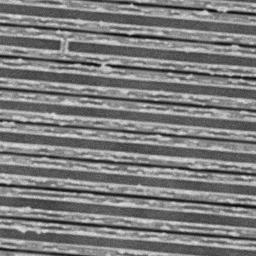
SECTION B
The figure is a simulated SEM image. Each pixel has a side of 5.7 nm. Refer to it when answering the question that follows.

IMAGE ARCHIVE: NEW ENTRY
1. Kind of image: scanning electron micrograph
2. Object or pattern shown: parallel lines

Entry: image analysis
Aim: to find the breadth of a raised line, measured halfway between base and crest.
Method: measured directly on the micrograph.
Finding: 47.6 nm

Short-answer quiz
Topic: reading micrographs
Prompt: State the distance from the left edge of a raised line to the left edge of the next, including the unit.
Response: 16 pixels